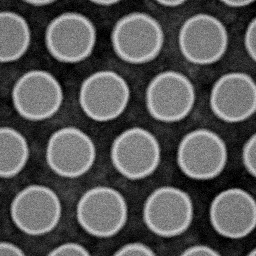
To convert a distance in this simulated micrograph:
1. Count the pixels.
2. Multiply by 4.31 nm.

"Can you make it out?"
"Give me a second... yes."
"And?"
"a regular array of raised bodies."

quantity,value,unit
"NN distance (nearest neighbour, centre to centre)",66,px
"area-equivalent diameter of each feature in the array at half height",206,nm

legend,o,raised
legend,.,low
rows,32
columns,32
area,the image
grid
....................oo.......oo.
................................
ooo....oooo....oooo.....ooo.....
ooo...oooooo..oooooo...ooooo...o
oooo..oooooo..oooooo..oooooo...o
oooo..oooooo..oooooo...ooooo...o
ooo...ooooo....ooooo...ooooo...o
o.......oo......oo......ooo.....
................................
...ooo......ooo.....ooo.....ooo.
..ooooo...oooooo...ooooo...ooooo
..oooooo..oooooo...ooooo...ooooo
..oooooo..oooooo...ooooo..oooooo
..ooooo...ooooo....ooooo...ooooo
...ooo.....ooo.....oooo....oooo.
................................
oo.....ooo......oo......oo......
ooo...ooooo....oooo....oooo....o
ooo...oooooo..oooooo..oooooo...o
ooo...oooooo..oooooo..oooooo...o
ooo...ooooo...oooooo..oooooo...o
oo.....ooo.....oooo....oooo....o
................................
....oo..........................
..ooooo....oooo....oooo....oooo.
..ooooo...oooooo..oooooo...ooooo
.oooooo...oooooo..oooooo..oooooo
..ooooo...oooooo..oooooo...ooooo
...oooo....oooo....oooo....ooooo
.............................o..
o...............................
ooo....oooo....oooo....oooo.....